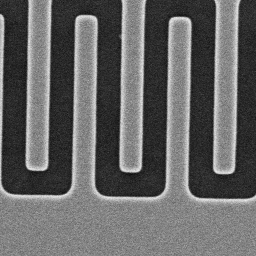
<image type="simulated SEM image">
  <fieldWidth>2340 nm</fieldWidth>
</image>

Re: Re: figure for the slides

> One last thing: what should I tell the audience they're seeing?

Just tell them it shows groups of lines, slits or small figures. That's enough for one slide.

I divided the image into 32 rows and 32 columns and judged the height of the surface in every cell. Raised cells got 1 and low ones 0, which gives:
00001100000000011100000000011100
00001100000000011100000000011100
00001100011100011100011100011100
00001100011100011100011100011100
00001100011100011100011100011100
00001100011100011100011100011100
00001100011100011100011100011100
00001100011100011100011100011100
00001100011100011100011100011100
00011100011100011100011100011100
00011100011100011100011100011100
00011100011100011100011100011100
00011100011100011100011100011100
00011100011100011100011100011100
00011100011100011100011100011100
00011100011100011100011100011100
00011100011100011100011100011100
00011100011100011100011100011000
00011100011100011100011100011000
00011100011100011100011000011000
00011100011100011100011000011000
00000000011100000000011000011000
00000000011100000000011000000000
00000000011100000000011100000000
11111111111110000000111100000000
11111111111111111111111111111111
11111111111111111111111111111111
11111111111111111111111111111111
11111111111111111111111111111111
11111111111111111111111111111111
11111111111111111111111111111111
11111111111111111111111111111111